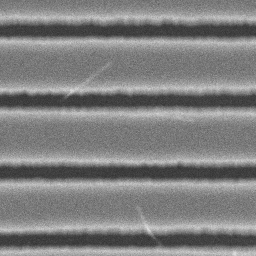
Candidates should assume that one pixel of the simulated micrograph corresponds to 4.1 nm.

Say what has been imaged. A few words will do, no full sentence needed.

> lines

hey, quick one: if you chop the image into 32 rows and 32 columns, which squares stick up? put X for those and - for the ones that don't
XXXXXXXXXXXXXXXXXXXXXXXXXXXXXXXX
XXXXXXXXXXXXXXXXXXXXXXXXXXXXXXXX
XXXXXXXXXXXXXXXXXXXXXXXXXXXXXXXX
--------------------------------
--------------------------------
XXXXXXXXXXXXXXXXXXXXXXXXXXXXXXXX
XXXXXXXXXXXXXXXXXXXXXXXXXXXXXXXX
XXXXXXXXXXXXXXXXXXXXXXXXXXXXXXXX
XXXXXXXXXXXXXXXXXXXXXXXXXXXXXXXX
XXXXXXXXXXXXXXXXXXXXXXXXXXXXXXXX
XXXXXXXXXXXXXXXXXXXXXXXXXXXXXXXX
XXXXXXXXXXXXXXXXXXXXXXXXXXXXXXX-
--------------------------------
--------------------------------
XXXXXXXXXXXXXXXXXXXXXXXXXXXXXXXX
XXXXXXXXXXXXXXXXXXXXXXXXXXXXXXXX
XXXXXXXXXXXXXXXXXXXXXXXXXXXXXXXX
XXXXXXXXXXXXXXXXXXXXXXXXXXXXXXXX
XXXXXXXXXXXXXXXXXXXXXXXXXXXXXXXX
XXXXXXXXXXXXXXXXXXXXXXXXXXXXXXXX
-X--XXX--XXXXXXXXXXXXX-XXXXXXXXX
--------------------------------
----------------X-X-------------
XXXXXXXXXXXXXXXXXXXXXXXXXXXXXXXX
XXXXXXXXXXXXXXXXXXXXXXXXXXXXXXXX
XXXXXXXXXXXXXXXXXXXXXXXXXXXXXXXX
XXXXXXXXXXXXXXXXXXXXXXXXXXXXXXXX
XXXXXXXXXXXXXXXXXXXXXXXXXXXXXXXX
XXXXXXXXXXXXXXXXXXXXXXXXXXXXXXXX
--------------------------------
--------------------------------
XXXXXXXXXXXXXXXXXXXXXXXXXXXXXXXX